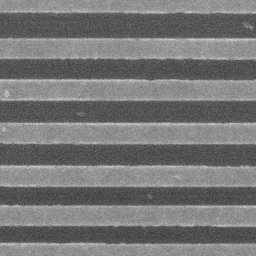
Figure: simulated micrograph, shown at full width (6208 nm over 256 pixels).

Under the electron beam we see lines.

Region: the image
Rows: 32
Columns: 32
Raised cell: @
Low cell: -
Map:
@@@@@@@@@@@@@@@@@@@@@@@@@@@@@@@@
----@-@@@------@@@@@@@-@@@@@@@@@
--------------------------------
--------------------------------
--------------------------------
@@@@@@@@@@@@@@@@@@@@@@@@@@@@@@@@
@@@@@@@@@@@@@@@@@@@@@@@@@@@@@@@@
--------------------------------
--------------------------------
--------------------------------
@@@@@@@@@@@@@@@@@@@@@@@@@@@@@@@@
@@@@@@@@@@@@@@@@@@@@@@@@@@@@@@@@
--------------------------------
--------------------------------
--------------------------------
@@@@@@@@@@@@@@@@@@@@@@@@@@@@@@@@
@@@@@@@@@@@@@@@@@@@@@@@@@@@@@@@@
@@@@@@@@@@@@@@@@@@@@@@@@@@@@@@@@
--------------------------------
--------------------------------
--------------------------------
@@@@@@@@@@@@@@@@@@@@@@@@@@@@@@@@
@@@@@@@@@@@@@@@@@@@@@@@@@@@@@@@@
--------------------------------
--------------------------------
--------------------------------
@@@@@@@@@@@@@@@@@@@@@@@@@@@@@@@@
@@@@@@@@@@@@@@@@@@@@@@@@@@@@@@@@
--------------------------------
--------------------------------
@@@@@@@@@@@---------------------
@@@@@@@@@@@@@@@@@@@@@@@@@@@@@@@@